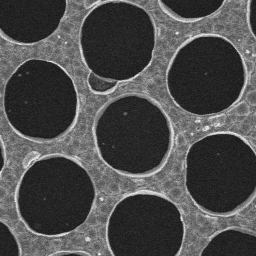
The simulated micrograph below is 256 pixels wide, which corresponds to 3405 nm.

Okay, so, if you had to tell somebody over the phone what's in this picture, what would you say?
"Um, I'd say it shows holes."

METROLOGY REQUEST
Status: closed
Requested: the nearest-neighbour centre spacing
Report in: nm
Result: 1250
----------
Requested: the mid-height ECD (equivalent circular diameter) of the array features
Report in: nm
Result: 1040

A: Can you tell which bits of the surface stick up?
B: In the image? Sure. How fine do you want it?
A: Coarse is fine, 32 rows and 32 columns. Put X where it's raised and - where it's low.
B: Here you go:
--------XXXXX----XXX--------XXX-
--------XXX-------XXX------XXXX-
--------XXX--------XXXXXXXXXXXX-
-------XXX---------XXXXXXXXXXXX-
X-----XXXX---------XXXXXXXXXXXXX
XXXXXXXXXX---------XXXX------XXX
XXXXXXXXXX---------XXX--------XX
XXXX-XXXXXX--------XXX--------XX
XX------XXX-------XXX----------X
X--------XX------XXXX----------X
X--------XX---XXXXXXX---------XX
X--------XXXXXXXXXXXX---------XX
----------XXXX-----XXX-------XXX
X---------XXX-------XXX-----XXXX
X--------XXX---------XXXXXXXXXXX
X--------XXX---------XXXXXXXXXXX
XX------XXXX---------XXXXXXXXXXX
XXXXX--XXXXX---------XXXX-----XX
XXXXXXXXXXXX---------XXX-------X
-XXXXX--XXXXX--------XX---------
XXXX------XXX-------XXX---------
XXX--------XXXX----XXXX---------
XXX--------XXXXXXXXXXXX---------
XX----------XXXXXXXXXXX---------
XX----------XXXXX---XXXX--------
XX---------XXXX-------XXX------X
XX---------XXX--------XXXX---XXX
XXX--------XXX---------XXXXXXXXX
-XXX------XXX----------XXXXXX-XX
--XXXXXXXXXXXX---------XXXX-----
--XXXXXXXXXXXX---------XXX------
--XXXXXX--XXXX--------XXX-------